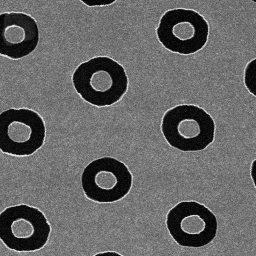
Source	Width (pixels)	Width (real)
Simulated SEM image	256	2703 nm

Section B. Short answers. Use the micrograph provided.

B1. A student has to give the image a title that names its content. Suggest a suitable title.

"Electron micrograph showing ring-shaped grooves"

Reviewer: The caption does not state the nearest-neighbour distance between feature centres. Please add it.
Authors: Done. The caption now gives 1020 nanometers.